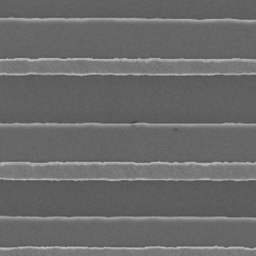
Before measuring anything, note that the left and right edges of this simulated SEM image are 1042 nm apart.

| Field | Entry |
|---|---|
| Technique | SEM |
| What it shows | lines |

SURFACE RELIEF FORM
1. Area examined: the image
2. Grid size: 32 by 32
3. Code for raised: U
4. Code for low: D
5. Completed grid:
DDDDDDDDDDDDDDDDDDDDDDDDDDDDDDDD
DDDDDDDDDDDDDDDDDDDDDDDDDDDDDDDD
UUUUUUUUUUUUUUUUUUUUUUUUDDUUUUDD
UUUUUUUUUUUUUUUUUUUUUUUUUUUUUUUU
UUUUUUUUUUUUUUUUUUUUUUUUUUUUUUUU
UUUUUUUUUUUUUUUUUUUUUUUUUUUUUUUU
UUUUUUUUUUUUUUUUUUUUUUUUUUUUUUUU
UUUUUUUUUUUUUUUUUUUUUUUUUUUUUUUU
UUUUUUUUUUUUUUUUUUUUUUUUUUUUUUUU
DDDDDDDDDDDDDDDDDDDDDDDDDDDDDDDD
DDDDDDDDDDDDDDDDDDDDDDDDDDDDDDDD
DDDDDDDDDDDDDDDDDDDDDDDDDDDDDDDD
DDDDDDDDDDDDDDDDDDDDDDDDDDDDDDDD
DDDDDDDDDDDDDDDDDDDDDDDDDDDDDDDD
DDDDDDDDDDDDDDDDDDDDDDDDDDDDDDDD
DDDDDDDDDDUUDDDDDUUDDDDDDDDDUDDD
UUUUUUUUUUUUUUUUUUUUUUUUUUUUUUUU
UUUUUUUUUUUUUUUUUUUUUUUUUUUUUUUU
UUUUUUUUUUUUUUUUUUUUUUUUUUUUUUUU
UUUUUUUUUUUUUUUUUUUUUUUUUUUUUUUU
UUUUUUUUUUUUUUUUUUUUUUUUUUUUUUUU
UUUUUUUUUUUUUUUUUUUUUUUUUUUUUUUU
DDDDDDDDDDDDDUUDDDDDDDDDDDDUDUDD
DDDDDDDDDDDDDDDDDDDDDDDDDDDDDDDD
DDDDDDDDDDDDDDDDDDDDDDDDDDDDDDDD
DDDDDDDDDDDDDDDDDDDDDDDDDDDDDDDD
DDDDDDDDDDDDDDDDDDDDDDDDDDDDDDDD
UUUUUUUUUUUUUUUUUUUUUUUUUUUUUUUU
UUUUUUUUUUUUUUUUUUUUUUUUUUUUUUUU
UUUUUUUUUUUUUUUUUUUUUUUUUUUUUUUU
UUUUUUUUUUUUUUUUUUUUUUUUUUUUUUUU
UUUUUUUUUUUUUUUUUUUUUUUUUUUUUUUU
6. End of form